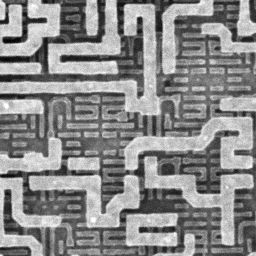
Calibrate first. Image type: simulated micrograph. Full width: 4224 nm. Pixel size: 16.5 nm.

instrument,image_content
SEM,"wiring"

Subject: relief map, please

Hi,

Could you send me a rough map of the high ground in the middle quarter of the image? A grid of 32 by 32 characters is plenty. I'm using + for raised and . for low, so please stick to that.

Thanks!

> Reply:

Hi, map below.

+++++++++++++.......+++..+++....
+++++++++++++.......+++..+++....
....................+++.........
....................+++.........
...............+++..+++.........
++++++++++++++++++..+++.........
++++++++++++++++++..+++.........
...............+++..+++.........
................++.+++++........
................++++++++........
................++++++++........
................++++++++........
......................+.........
................................
................................
................................
................................
................................
...................+++++...++...
.................+++++++++++++++
................++++++++++++++++
...............+++++............
...............+++..............
...............+++..+++.........
.++++++++.......++..+++.........
.++++++++.......++..+++.........
....................+++.........
....................+++.........
+++++++++......+++..++++++++++++
+++++++++......+++..++++++++++++
+++++++++......+++..++++++++++++
......+++......+++............++